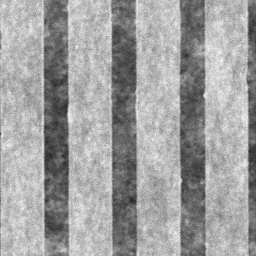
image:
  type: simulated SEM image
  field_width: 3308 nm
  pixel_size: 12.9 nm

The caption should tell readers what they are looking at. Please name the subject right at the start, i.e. one or a few lines or trenches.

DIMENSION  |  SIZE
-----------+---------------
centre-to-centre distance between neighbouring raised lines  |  0.88 microns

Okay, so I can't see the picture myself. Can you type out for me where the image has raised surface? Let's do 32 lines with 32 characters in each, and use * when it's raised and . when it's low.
*****....*****...*****....*****.
*****....*****...*****....*****.
*****....*****...*****....*****.
*****....*****...*****....*****.
*****....*****...*****....*****.
*****....*****...*****....*****.
*****....*****...*****....*****.
*****....*****...*****....*****.
*****....*****...*****....*****.
*****....*****...*****....*****.
*****....*****...*****....*****.
*****....*****...*****....*****.
*****....*****...*****....*****.
*****....*****...*****....*****.
*****....*****...*****....*****.
*****....*****...*****....*****.
*****....*****...*****....*****.
*****....*****...******...*****.
*****....*****...*****....*****.
*****....*****...*****....*****.
*****....*****...******...*****.
*****....*****...******...*****.
*****....*****...******...*****.
*****....*****...******...*****.
*****....*****...******...*****.
*****....*****...******...*****.
*****....*****...******...*****.
*****....*****...******...*****.
*****....*****...*****....*****.
*****....*****...*****....*****.
*****..*.*****...*****....*****.
*****....*****...*****....*****.